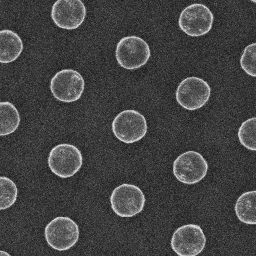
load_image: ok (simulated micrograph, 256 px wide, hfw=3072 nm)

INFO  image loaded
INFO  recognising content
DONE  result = a regular array of raised bodies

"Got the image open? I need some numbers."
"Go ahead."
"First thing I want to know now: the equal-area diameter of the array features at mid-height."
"392 nanometres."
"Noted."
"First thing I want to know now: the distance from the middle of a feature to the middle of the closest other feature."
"855 nm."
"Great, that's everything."